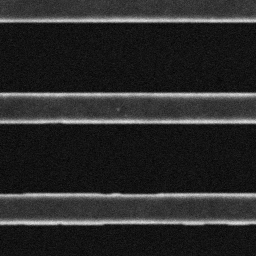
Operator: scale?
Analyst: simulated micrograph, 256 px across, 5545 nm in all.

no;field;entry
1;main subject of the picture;lines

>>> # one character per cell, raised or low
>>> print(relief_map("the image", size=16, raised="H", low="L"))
HHHHHHHHHHHHHHHH
LLLLLLLLLLLLLLLL
LLLLLLLLLLLLLLLL
LLLLLLLLLLLLLLLL
LLLLLLLLLLLLLLLL
LLLLLLLLLLLLLLLL
HHHHHHHHHHHHHHHH
HHHHHHHHHHHHHHHH
LLLLLLLLLLLLLLLL
LLLLLLLLLLLLLLLL
LLLLLLLLLLLLLLLL
LLLLLLLLLLLLLLLL
HHHHHHHHHHHHHHHH
HHHHHHHHHHHHHHHH
LLLLLLLLLLLLLLLL
LLLLLLLLLLLLLLLL